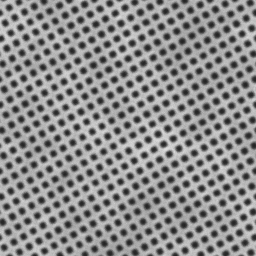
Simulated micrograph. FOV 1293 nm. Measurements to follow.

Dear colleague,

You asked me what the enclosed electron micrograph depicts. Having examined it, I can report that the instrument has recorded a regular array of holes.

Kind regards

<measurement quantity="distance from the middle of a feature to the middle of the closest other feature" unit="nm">55.9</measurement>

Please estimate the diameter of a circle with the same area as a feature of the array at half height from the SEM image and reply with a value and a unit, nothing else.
0.0382 um